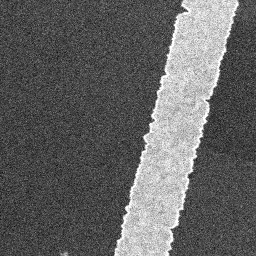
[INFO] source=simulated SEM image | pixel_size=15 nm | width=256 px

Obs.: one or a few lines or trenches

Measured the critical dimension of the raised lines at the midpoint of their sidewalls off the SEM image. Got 767 nm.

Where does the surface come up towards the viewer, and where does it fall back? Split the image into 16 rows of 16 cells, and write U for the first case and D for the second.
DDDDDDDDDDDDUUUD
DDDDDDDDDDDUUUDD
DDDDDDDDDDDUUUDD
DDDDDDDDDDDUUUDD
DDDDDDDDDDUUUUDD
DDDDDDDDDDUUUDDD
DDDDDDDDDDUUUDDD
DDDDDDDDDDUUUDDD
DDDDDDDDDUUUUDDD
DDDDDDDDDUUUDDDD
DDDDDDDDDUUUDDDD
DDDDDDDDUUUUDDDD
DDDDDDDDUUUDDDDD
DDDDDDDDUUUDDDDD
DDDDDDDDUUUDDDDD
DDDDDDDUUUUDDDDD